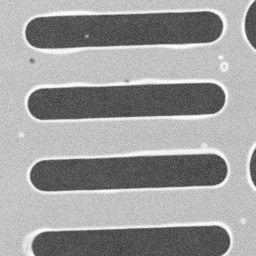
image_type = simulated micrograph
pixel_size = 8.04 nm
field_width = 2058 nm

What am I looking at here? groups of lines, slits or small figures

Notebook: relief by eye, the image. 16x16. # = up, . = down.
################
##............#.
##...........##.
################
################
###...........##
##............##
###..###########
################
############.###
##............##
##............##
################
################
###...........##
##............##